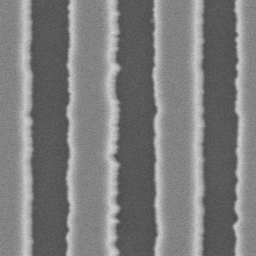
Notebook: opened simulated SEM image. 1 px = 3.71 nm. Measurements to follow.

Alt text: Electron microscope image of lines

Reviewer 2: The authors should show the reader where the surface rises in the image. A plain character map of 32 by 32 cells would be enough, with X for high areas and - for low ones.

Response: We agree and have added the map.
XXXX-----XXXXX-----XXXXXX----XXX
XXXX-----XXXXX-----XXXXXX----XXX
XXXX-----XXXXX-----XXXXXX-----XX
XXXX-----XXXXXX----XXXXXX-----XX
XXXX-----XXXXX-----XXXXXX-----XX
XXXX-----XXXXX-----XXXXXX-----XX
XXXX-----XXXXX-----XXXXXX-----XX
XXXX----XXXXXX-----XXXXXX-----XX
XXXX----XXXXXXX----XXXXXX-----XX
XXXX-----XXXXX-----XXXXXX-----XX
XXXX-----XXXXX-----XXXXXX----XXX
XXXX-----XXXXX-----XXXXXX-----XX
XXXX-----XXXXX-----XXXXXX-----XX
XXXX----XXXXXXX-----XXXXX----XXX
XXXX----XXXXXXX----XXXXXX-----XX
XXXX-----XXXXX-----XXXXXX-----XX
XXXX-----XXXXXX----XXXXXX-----XX
XXXX----XXXXXX-----XXXXXX-----XX
XXXX-----XXXXX-----XXXXXX-----XX
XXXX-----XXXXX-----XXXXXX-----XX
XXXX-----XXXXXX----XXXXXX-----XX
XXXX----XXXXXX-----XXXXXX-----XX
XXXX----XXXXXX-----XXXXXX-----XX
XXXX----XXXXXX-----XXXXXX-----XX
XXXX----XXXXXX-----XXXXXX-----XX
XXXX-----XXXXX-----XXXXXX----XXX
XXXX-----XXXXX-----XXXXXX----XXX
XXXX----XXXXXX-----XXXXXX-----XX
XXXX-----XXXXX------XXXXX----XXX
XXXX----XXXXXX------XXXXX-----XX
XXXX----XXXXXX-----XXXXXX----XXX
XXXX----XXXXXX-----XXXXXX----XXX